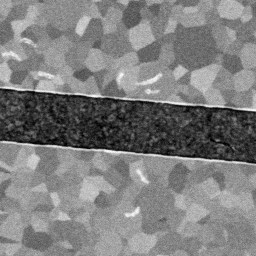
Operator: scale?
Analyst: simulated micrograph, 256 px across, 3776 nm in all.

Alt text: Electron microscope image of one or a few lines or trenches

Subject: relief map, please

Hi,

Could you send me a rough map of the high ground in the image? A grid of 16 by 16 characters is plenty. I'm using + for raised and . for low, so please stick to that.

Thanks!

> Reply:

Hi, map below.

++++++++++++++++
++++++++++++++++
++++++++++++++++
++++++++++++++++
++++++++++++++++
++++++++++++++++
...........+++++
................
................
+++++++.........
++++++++++++++++
++++++++++++++++
++++++++++++++++
++++++++++++++++
++++++++++++++++
++++++++++++++++